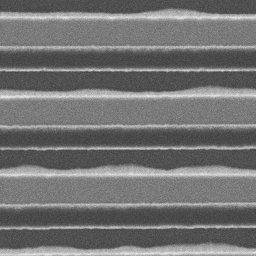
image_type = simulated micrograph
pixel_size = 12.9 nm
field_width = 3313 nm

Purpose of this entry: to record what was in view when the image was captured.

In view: lines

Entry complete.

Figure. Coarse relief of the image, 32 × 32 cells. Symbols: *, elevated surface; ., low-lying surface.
................................
................................
********************************
********************************
********************************
********************************
********************************
********************************
********************************
................................
................................
................................
********************************
********************************
********************************
********************************
********************************
********************************
********************************
................................
................................
................................
********************************
********************************
********************************
********************************
********************************
********************************
***************..***...*........
................................
................................
.........................****...